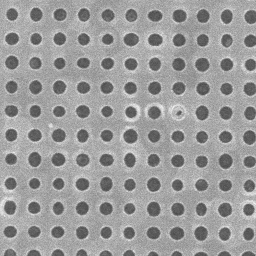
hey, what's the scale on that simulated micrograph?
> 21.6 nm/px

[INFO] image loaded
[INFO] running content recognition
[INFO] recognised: a regular array of holes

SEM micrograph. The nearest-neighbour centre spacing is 0.512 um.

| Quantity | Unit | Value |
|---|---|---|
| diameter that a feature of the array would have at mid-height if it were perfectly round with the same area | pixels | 13.3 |